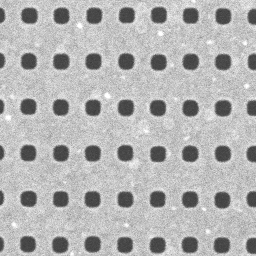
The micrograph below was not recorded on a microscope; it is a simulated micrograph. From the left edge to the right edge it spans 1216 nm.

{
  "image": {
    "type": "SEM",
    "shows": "a regular array of holes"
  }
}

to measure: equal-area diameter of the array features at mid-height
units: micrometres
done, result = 0.082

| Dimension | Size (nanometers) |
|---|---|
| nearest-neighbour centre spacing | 153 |